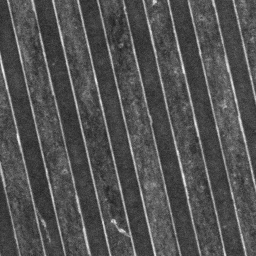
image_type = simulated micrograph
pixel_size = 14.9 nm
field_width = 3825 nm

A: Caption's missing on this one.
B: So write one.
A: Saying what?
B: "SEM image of parallel lines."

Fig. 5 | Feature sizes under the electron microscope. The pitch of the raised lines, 658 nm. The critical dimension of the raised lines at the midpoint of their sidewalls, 0.37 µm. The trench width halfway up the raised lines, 284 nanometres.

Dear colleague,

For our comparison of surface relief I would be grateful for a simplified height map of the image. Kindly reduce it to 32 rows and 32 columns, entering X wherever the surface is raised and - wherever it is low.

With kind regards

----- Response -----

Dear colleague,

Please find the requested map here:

-XXX---XXX--XXX---XXX---XXX--XXX
-XXX---XXX---XXX--XXX---XXX--XXX
--XXX--XXX---XXX--XXXX--XXX---XX
--XXX--XXXX--XXX---XXX--XXX---XX
--XXX---XXX--XXX---XXX---XXX--XX
--XXX---XXX--XXXX--XXX---XXX--XX
--XXX---XXX---XXX--XXX---XXX---X
---XXX--XXX---XXX---XXX--XXX---X
---XXX---XXX--XXX---XXX--XXXX--X
X--XXX---XXX--XXX---XXX---XXX--X
X--XXXX--XXX---XXX--XXX---XXX---
X---XXX--XXX---XXX--XXXX--XXX---
X---XXX--XXXX--XXX---XXX--XXXX--
X---XXX---XXX--XXX---XXX---XXX--
XX--XXX---XXX--XXXX--XXX---XXX--
XX--XXXX--XXX---XXX--XXXX--XXX--
XX---XXX--XXX---XXX---XXX--XXX--
XX---XXX---XXX--XXX---XXX--XXXX-
XXX--XXX---XXX--XXXX--XXX---XXX-
XXX--XXXX--XXX---XXX--XXX---XXX-
XXX---XXX--XXX---XXX---XXX--XXX-
XXX---XXX--XXXX--XXX---XXX--XXXX
XXXX--XXX---XXX--XXX---XXX---XXX
-XXX--XXX---XXX--XXXX--XXX---XXX
-XXX---XXX--XXX---XXX--XXXX--XXX
-XXX---XXX--XXX---XXX---XXX--XXX
-XXX---XXX---XXX--XXX---XXX---XX
-XXXX--XXX---XXX--XXXX--XXX---XX
--XXX--XXXX--XXX---XXX--XXX---XX
--XXX---XXX--XXX---XXX---XXX--XX
--XXX---XXX--XXXX--XXX---XXX--XX
--XXXX--XXX---XXX--XXX---XXX---X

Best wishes